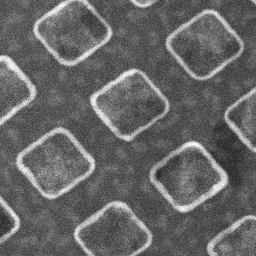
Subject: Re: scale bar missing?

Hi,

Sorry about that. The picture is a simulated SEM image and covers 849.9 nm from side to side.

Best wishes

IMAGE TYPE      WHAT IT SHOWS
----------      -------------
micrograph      raised bodies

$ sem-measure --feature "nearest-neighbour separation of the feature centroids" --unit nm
311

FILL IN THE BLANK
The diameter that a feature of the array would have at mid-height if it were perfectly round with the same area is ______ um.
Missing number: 0.212